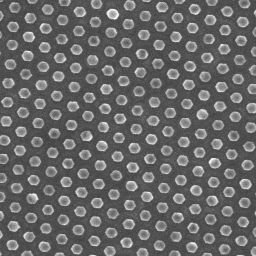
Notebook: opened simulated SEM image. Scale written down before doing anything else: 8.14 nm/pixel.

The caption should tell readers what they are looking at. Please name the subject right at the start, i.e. a regular array of raised bodies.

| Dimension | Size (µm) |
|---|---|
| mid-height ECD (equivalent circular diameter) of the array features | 0.0842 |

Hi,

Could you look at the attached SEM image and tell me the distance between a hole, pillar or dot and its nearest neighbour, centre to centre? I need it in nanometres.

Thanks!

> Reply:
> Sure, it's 150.